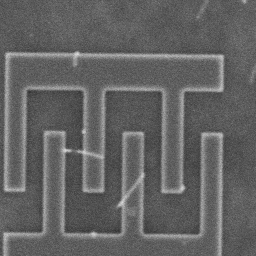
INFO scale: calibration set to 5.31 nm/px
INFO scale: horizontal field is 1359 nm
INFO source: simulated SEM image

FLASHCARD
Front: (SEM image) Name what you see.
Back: groups of lines, slits or small figures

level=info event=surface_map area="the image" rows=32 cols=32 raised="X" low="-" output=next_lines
--------------------------------
--------------------------------
--------------------------------
--------------------------------
--------------------------------
--------------------------------
--------------------------------
-XXXXXXXXXXXXXXXXXXXXXXXXXXX----
-XXXXXXXXXXXXXXXXXXXXXXXXXXX----
-XXXXXXXXXXXXXXXXXXXXXXXXXXX----
-XXXXXXXXXXXXXXXXXXXXXXXXXXX----
-XX-------XXX-------XXX---------
-XX--------XX-------XXX---------
-XX--------XX-------XXX---------
-XX--------XX-------XXX---------
-XX--------XX-------XXX---------
-XX---XX--XXX-------XXX---------
-XX---XX---XX--XXX--XXX--XXX----
-XX---XX---XX--XXX--XXX--XXX----
-XX---XX--XXX--XXX--XXX--XXX----
-XX---XX--XXX--XXX--XXX--XXX----
-XX--XXX--XXX--XXX--XXX--XXX----
-XX--XXX--XXX--XXX--XXX--XXX----
-XX--XXX--XXX--XXX--XXX--XXX----
-----XXX-------XXX-------XXX----
-----XXX-------XXX-------XXX----
-----XXX-------XXX-------XXX----
-----XXX-------XXX-------XXX----
-----XXX-------XXX-------XXX----
-XXXXXXXXXXXXXXXXXXXXXXXXXXX----
-XXXXXXXXXXXXXXXXXXXXXXXXXXX----
-XXXXXXXXXXXXXXXXXXXXXXXXXXX----